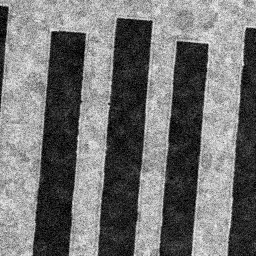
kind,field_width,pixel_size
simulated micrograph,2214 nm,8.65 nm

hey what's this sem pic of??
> one or a few lines or trenches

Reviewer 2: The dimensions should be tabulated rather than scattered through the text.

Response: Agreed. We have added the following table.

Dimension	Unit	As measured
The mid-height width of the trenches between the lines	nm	317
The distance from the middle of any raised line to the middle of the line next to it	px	64.3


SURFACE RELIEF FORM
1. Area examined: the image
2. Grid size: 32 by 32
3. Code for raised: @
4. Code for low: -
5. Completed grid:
@@@@@@@@@@@@@@@@@@@@@@@@@@@@@@@@
-@@@@@@@@@@@@@@@@@@@@@@@@@@@@@@@
-@@@@@@@@@@@@@@----@@@@@@@@@@@@@
-@@@@@@@@@@@@@-----@@@@@@@@@@@@-
-@@@@@-----@@@-----@@@@@@@@@@@--
-@@@@@-----@@@-----@@@----@@@@--
-@@@@@-----@@@-----@@@----@@@@--
-@@@@@-----@@@-----@@@----@@@@--
-@@@@@-----@@@-----@@@----@@@@--
-@@@@@----@@@@-----@@@----@@@@--
@@@@@@----@@@@-----@@@----@@@@--
@@@@@@----@@@@-----@@-----@@@@--
@@@@@@----@@@@----@@@-----@@@@--
@@@@@-----@@@@----@@@-----@@@@--
@@@@@-----@@@-----@@@-----@@@@--
@@@@@-----@@@-----@@@----@@@@@--
@@@@@-----@@@-----@@@----@@@@@--
@@@@@-----@@@-----@@@----@@@@---
@@@@@-----@@@-----@@@----@@@@---
@@@@@-----@@@-----@@@----@@@@---
@@@@@-----@@@-----@@@----@@@@---
@@@@@----@@@@-----@@@----@@@@---
@@@@@----@@@@-----@@-----@@@@---
@@@@@----@@@@-----@@-----@@@@---
@@@@@----@@@@----@@@-----@@@@---
@@@@@----@@@-----@@@-----@@@@---
@@@@-----@@@-----@@@-----@@@@---
@@@@-----@@@-----@@@----@@@@@---
@@@@-----@@@-----@@@----@@@@@---
@@@@-----@@@-----@@@----@@@@@---
@@@@-----@@@-----@@@----@@@@----
@@@@-----@@@-----@@@----@@@@----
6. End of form